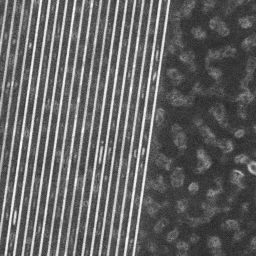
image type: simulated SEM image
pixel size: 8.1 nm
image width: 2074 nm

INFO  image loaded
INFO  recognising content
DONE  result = parallel lines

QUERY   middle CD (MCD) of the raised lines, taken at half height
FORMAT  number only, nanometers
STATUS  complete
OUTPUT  14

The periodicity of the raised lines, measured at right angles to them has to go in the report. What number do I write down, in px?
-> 8.46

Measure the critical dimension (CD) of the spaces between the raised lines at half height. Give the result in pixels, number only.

6.81